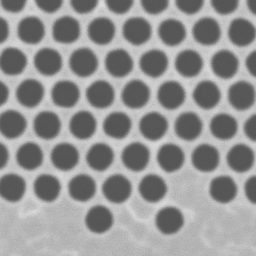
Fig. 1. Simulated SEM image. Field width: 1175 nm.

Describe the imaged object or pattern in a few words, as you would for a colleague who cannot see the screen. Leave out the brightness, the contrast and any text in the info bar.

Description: a regular array of holes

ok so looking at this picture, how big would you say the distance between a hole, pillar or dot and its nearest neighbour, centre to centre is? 0.161 micrometres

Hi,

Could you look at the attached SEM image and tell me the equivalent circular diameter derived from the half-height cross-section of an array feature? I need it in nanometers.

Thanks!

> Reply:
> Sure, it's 125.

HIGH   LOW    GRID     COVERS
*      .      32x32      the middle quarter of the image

**......**.......**.......**....
**......***......**......***....
***....*****....*****...*****...
********************************
..******...*****....******..****
...***......***......***.....***
....**......***......***......**
....*........*.......**.......**
....**.......*.......**.......**
...***......***......***......**
..*****....*****....*****....***
********************************
***....*****...*****....******..
**......***.....****.....***....
*.......**.......**.......**....
*.......**.......**.......**....
*.......**......***.......**....
**.....****.....****.....***....
****..******...*****....******..
********************************
..*****....*****....*****...****
...***......***......***......**
....**......***.......*.......**
....**......**.......**.......**
...***......***......***......**
...***.....****......***.....***
.*******..*******...*****...****
********************************
**.....****....*****....********
**......**......***......*******
*.......**.......**......*******
*.......*........**.......******